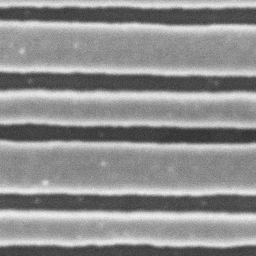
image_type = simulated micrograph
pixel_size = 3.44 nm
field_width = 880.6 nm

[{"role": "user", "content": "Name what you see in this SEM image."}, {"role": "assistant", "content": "lines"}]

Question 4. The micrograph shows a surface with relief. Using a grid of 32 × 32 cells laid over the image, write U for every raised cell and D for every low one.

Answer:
UUUUUUUUUUUUUUUUUUUUUUUUUUUUUUUU
DDDDDDDDDDDDDDDDDDDDDDDDDDDDDDDD
DDDDDDDDDDDDDDDDDDDDDDDDDDDDDDDD
UUUUUUUUUUUUUUUUUUUUUUUUUUUUUUUU
UUUUUUUUUUUUUUUUUUUUUUUUUUUUUUUU
UUUUUUUUUUUUUUUUUUUUUUUUUUUUUUUU
UUUUUUUUUUUUUUUUUUUUUUUUUUUUUUUU
UUUUUUUUUUUUUUUUUUUUUUUUUUUUUUUU
UUUUUUUUUUUUUUUUUUUUUUUUUUUUUUUU
DDDDDDDDDDDDDDDDDDDDDDDDDDDDDDDD
DDDDDDDDDDDDDDDDDDDDDDDDDDDDDDDD
DDUUUUDDDDDDDDDDDDDDDDDDDDDDDDDD
UUUUUUUUUUUUUUUUUUUUUUUUUUUUUUUU
UUUUUUUUUUUUUUUUUUUUUUUUUUUUUUUU
UUUUUUUUUUUUUUUUUUUUUUUUUUUUUUUU
UUDDDDUUUUUUUUUUUUUUUUUUUUUUUUUU
DDDDDDDDDDDDDDDDDDDDDDDDDDDDDDDD
DDDDDDDDDDDDDDDDDDDDDDDDDDDDDDDD
UUUUUUUUUUUUUUUUUUUUUUUUUUUUUUUU
UUUUUUUUUUUUUUUUUUUUUUUUUUUUUUUU
UUUUUUUUUUUUUUUUUUUUUUUUUUUUUUUU
UUUUUUUUUUUUUUUUUUUUUUUUUUUUUUUU
UUUUUUUUUUUUUUUUUUUUUUUUUUUUUUUU
UUUUUUUUUUUUUUUUUUUUUUUUUUUUUUUU
DDDDDDDDDDDDDDDDDDDDDDDDDDDDDDDD
DDDDDDDDDDDDDDDDDDDDDDDDDDDDDDDD
DDDDDDDDDDDDDDDDDDDDDDDDDDDDDDDD
UUUUUUUUUUUUUUUUUUUUUUUUUUUUUUUU
UUUUUUUUUUUUUUUUUUUUUUUUUUUUUUUU
UUUUUUUUUUUUUUUUUUUUUUUUUUUUUUUU
UUUUUUUUUUUUUUUDUDUUUUUUUUUUUUUU
DDDDDDDDDDDDDDDDDDDDDDDDDDDDDDDD